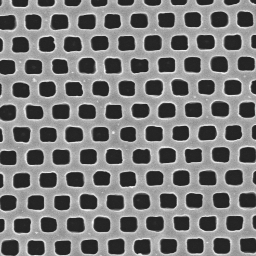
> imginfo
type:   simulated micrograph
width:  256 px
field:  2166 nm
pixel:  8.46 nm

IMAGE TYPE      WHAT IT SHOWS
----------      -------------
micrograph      a regular array of holes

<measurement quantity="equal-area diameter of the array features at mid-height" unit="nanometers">144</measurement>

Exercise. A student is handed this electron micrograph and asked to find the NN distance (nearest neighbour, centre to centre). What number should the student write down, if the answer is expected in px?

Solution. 25.6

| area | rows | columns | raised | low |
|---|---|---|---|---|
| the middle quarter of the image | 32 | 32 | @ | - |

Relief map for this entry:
-@@@----@@----@@-----@@@----@@--
-@@@----@@----@@@----@@@----@@--
@@@@@@-@@@@@@@@@@@@@@@@@@@@@@@@@
@@@@@@@@@@@@@@@@@@@@@@@@@@@@@@@@
@---@@@@--@@@@---@@@@---@@@----@
----@@@----@@-----@@-----@@----@
-----@@----@@@----@@----@@@----@
@----@@----@@@----@@@---@@@@---@
@@@@@@@@@@@@@@@@@@@@@@@@@@@@@@@@
@@@@@@@@@@@@@@@@@@@@@@@@@@@@@@@@
-@@@---@@@@---@@@----@@@----@@--
-@@@----@@----@@@----@@@----@@--
-@@@----@@-----@@----@@-----@@--
-@@@---@@@@---@@@@@@@@@@--@@@@@@
@@@@@@@@@@@@@@@@@@@@@@@@@@@@@@@@
@@@@@@@@@@@@@@@@@@@@@-@@@@@@@@@@
@---@@@----@@@----@@-----@@----@
-----@@----@@@----@@-----@@----@
-----@@----@@@----@@-----@@----@
@-@@@@@@--@@@@@@@@@@@@@@@@@@@@@@
@@@@@@@@@@@@@@@@@@@@@@@@@@@@@@@@
-@@@@---@@@---@@@@---@@@----@@--
--@@----@@@----@@-----@@----@@--
--@@----@@-----@@-----@@----@@--
-@@@----@@@----@@----@@@---@@@@-
@@@@@@@@@@@@@@@@@@@@@@@@@@@@@@@@
@@@@@@@@@@@@@@@@@@@@@@@@@@@@@@@@
@----@@@---@@@----@@@----@@@---@
-----@@-----@@----@@@----@@-----
@----@@----@@@----@@@----@@-----
@----@@@---@@@---@@@@@@@@@@@--@@
@@@@@@@@@@@@@@@@@@@@@@@@@@@@@@@@